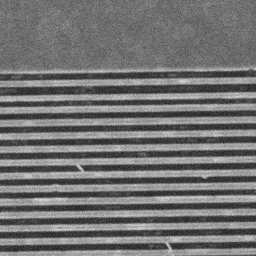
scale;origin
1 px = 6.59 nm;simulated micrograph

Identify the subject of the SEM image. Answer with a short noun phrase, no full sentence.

parallel lines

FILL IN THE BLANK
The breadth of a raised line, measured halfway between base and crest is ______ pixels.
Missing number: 5.87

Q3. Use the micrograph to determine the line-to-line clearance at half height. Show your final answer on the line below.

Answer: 49.4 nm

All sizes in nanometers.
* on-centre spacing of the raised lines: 86.7